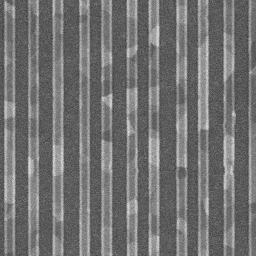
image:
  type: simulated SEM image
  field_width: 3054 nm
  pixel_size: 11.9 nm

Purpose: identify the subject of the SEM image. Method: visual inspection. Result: parallel lines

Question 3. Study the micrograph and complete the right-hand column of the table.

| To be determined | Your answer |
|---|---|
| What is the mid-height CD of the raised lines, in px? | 7.63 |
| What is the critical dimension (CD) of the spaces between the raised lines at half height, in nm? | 200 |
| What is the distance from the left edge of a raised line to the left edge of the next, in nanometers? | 291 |